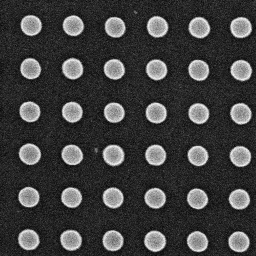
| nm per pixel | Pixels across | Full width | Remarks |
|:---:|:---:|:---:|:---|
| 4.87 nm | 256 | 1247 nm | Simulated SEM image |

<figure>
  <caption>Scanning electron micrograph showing a regular array of raised bodies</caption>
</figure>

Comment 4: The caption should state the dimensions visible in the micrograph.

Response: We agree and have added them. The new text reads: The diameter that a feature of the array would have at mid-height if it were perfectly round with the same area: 97.7 nm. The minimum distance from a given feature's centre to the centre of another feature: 41.9 px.